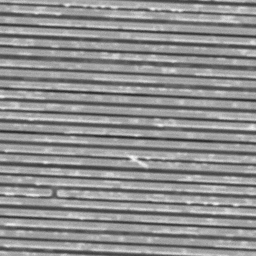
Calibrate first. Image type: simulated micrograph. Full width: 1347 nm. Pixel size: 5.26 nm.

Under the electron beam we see parallel lines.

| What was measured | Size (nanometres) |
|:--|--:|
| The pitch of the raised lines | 55.9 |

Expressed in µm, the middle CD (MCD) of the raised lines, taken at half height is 0.0348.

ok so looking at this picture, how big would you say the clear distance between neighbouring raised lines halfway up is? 20.4 nanometres